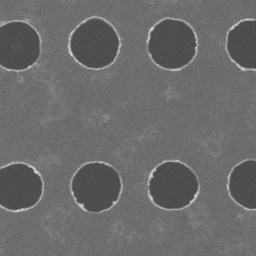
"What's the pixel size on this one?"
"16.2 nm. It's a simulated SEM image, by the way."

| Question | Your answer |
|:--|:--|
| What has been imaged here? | holes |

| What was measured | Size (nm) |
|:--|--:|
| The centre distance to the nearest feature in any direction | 1250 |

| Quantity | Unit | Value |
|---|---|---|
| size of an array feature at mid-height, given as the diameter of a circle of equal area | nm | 788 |